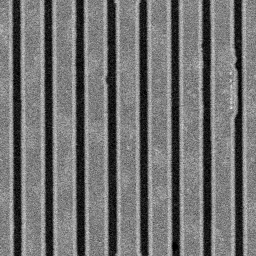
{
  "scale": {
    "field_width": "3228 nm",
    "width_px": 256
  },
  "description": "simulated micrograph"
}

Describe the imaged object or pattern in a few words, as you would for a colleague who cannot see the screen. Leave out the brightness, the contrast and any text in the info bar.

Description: parallel lines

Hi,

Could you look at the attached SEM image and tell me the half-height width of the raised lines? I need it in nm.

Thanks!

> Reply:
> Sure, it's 243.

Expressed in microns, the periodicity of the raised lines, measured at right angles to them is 0.399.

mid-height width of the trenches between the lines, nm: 158